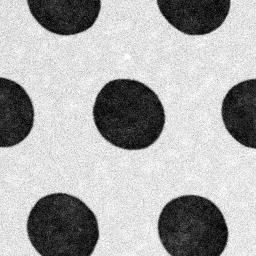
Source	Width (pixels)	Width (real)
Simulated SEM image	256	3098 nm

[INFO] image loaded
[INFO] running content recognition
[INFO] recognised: holes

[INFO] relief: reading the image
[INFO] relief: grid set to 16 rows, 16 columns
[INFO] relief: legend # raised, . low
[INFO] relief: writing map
##....####....##
###...#####...##
################
################
################
.#####...######.
..####....####..
..####....####..
..####....#####.
################
################
################
##...######..###
##....####....##
##....####....##
##....####....##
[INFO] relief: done